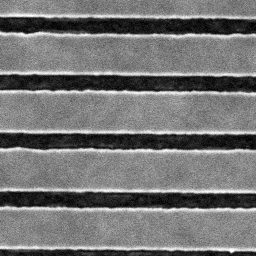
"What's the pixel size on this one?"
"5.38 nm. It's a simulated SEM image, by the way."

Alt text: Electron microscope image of lines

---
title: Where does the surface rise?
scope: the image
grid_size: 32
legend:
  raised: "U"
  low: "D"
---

UUUUUUUUUUUUUUUUUUUUUUUUUUUUUUUU
UUUUUUUUUUUUUUUUUUUUUUUUUUUUUUUU
DDDDDDDDDDDDDDDDDDDDDDDDDDDDDDDD
DDDDDDDDDDDDDDDDDDDDDDDDDDDDDDDD
UUUUUUUUUUUUUUUUUUUUUUUUUUUUUUUU
UUUUUUUUUUUUUUUUUUUUUUUUUUUUUUUU
UUUUUUUUUUUUUUUUUUUUUUUUUUUUUUUU
UUUUUUUUUUUUUUUUUUUUUUUUUUUUUUUU
UUUUUUUUUUUUUUUUUUUUUUUUUUUUUUUU
DDDDDDDDDDDDDDDDDDDDDDDDDDUUUUUU
DDDDDDDDDDDDDDDDDDDDDDDDDDDDDDDD
UUUUUUUUUUUUUUUUDDDDDDDDUDDDDDDD
UUUUUUUUUUUUUUUUUUUUUUUUUUUUUUUU
UUUUUUUUUUUUUUUUUUUUUUUUUUUUUUUU
UUUUUUUUUUUUUUUUUUUUUUUUUUUUUUUU
UUUUUUUUUUUUUUUUUUUUUUUUUUUUUUUU
DDDUUUUUUUUUUUUUUUUUUUUUUUUUUUUU
DDDDDDDDDDDDDDDDDDDDDDDDDDDDDDDD
DUUDDDDDDDDDDDDDDDDDDDDDDDDDDDDD
UUUUUUUUUUUUUUUUUUUUUUUUUUUUUUUU
UUUUUUUUUUUUUUUUUUUUUUUUUUUUUUUU
UUUUUUUUUUUUUUUUUUUUUUUUUUUUUUUU
UUUUUUUUUUUUUUUUUUUUUUUUUUUUUUUU
UUUUUUUUUUUUUUUUUUUUUUUUUUUUUUUU
DDDDDDDDDDDDDDDDDDDDDDDDDDDDDDDD
DDDDDDDDDDDDDDDDDDDDDDDDDDDDDDDD
UUUUUUUUUUUUUUUUUUUUUUUUUUUUUUUU
UUUUUUUUUUUUUUUUUUUUUUUUUUUUUUUU
UUUUUUUUUUUUUUUUUUUUUUUUUUUUUUUU
UUUUUUUUUUUUUUUUUUUUUUUUUUUUUUUU
UUUUUUUUUUUUUUUUUUUUUUUUUUUUUUUU
DDDDDDDDDDDDDDDDDDDDDDDDDDDDDDDD